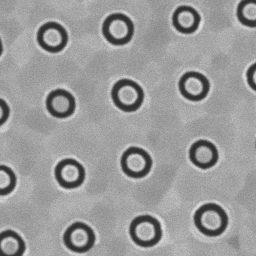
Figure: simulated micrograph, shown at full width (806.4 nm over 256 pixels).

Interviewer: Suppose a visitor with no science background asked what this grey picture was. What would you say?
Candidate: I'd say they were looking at a regular array of ring-shaped grooves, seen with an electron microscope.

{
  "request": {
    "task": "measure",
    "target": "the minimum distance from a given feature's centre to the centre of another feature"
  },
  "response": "208 nanometers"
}